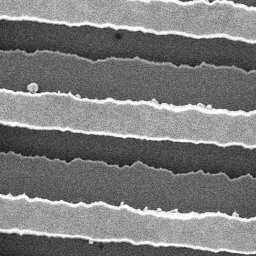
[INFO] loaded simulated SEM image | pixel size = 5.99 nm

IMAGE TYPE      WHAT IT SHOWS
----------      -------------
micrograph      lines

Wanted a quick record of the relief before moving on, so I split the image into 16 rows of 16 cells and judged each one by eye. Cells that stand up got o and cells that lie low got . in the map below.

oooooooooooooooo
....oooooooooooo
...............o
................
................
................
oooooooooo......
oooooooooooooooo
.......ooooooooo
................
................
................
ooo.............
oooooooooooooo..
.ooooooooooooooo
............oooo